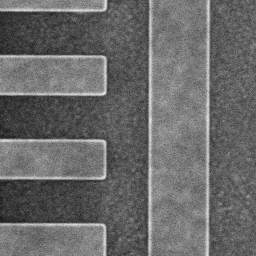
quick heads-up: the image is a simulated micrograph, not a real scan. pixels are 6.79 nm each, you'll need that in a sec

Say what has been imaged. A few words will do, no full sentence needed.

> groups of lines, slits or small figures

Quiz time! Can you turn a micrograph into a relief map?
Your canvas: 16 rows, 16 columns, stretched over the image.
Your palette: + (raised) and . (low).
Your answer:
++++++...++++...
.........++++...
.........++++...
++++++...++++...
+++++++..++++...
+++++++..++++...
.........++++...
.........++++...
.........++++...
+++++++..++++...
+++++++..++++...
.........++++...
.........++++...
.........++++...
+++++++..++++...
+++++++..++++...